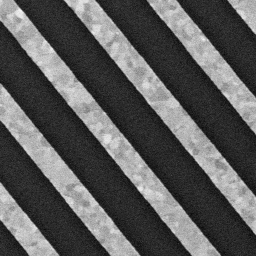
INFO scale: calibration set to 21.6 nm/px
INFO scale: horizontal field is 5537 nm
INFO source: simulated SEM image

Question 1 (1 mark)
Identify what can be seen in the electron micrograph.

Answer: lines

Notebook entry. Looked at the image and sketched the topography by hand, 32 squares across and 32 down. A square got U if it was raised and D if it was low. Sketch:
UUDDDDDDUUUUDDDDDDDUUUDDDDDDDUUU
UUUDDDDDDUUUUDDDDDDDUUUDDDDDDDUU
UUUUDDDDDDUUUUDDDDDDUUUUDDDDDDDU
DUUUDDDDDDDUUUUDDDDDDUUUUDDDDDDU
DDUUUDDDDDDDUUUUDDDDDDUUUUDDDDDD
DDUUUUDDDDDDDUUUDDDDDDDUUUDDDDDD
DDDUUUUDDDDDDUUUUDDDDDDDUUUDDDDD
DDDDUUUUDDDDDDUUUUDDDDDDUUUUDDDD
DDDDDUUUDDDDDDDUUUUDDDDDDUUUUDDD
DDDDDDUUUDDDDDDDUUUUDDDDDDUUUUDD
DDDDDDDUUUDDDDDDDUUUDDDDDDDUUUDD
UDDDDDDUUUUDDDDDDUUUUDDDDDDDUUUD
UUDDDDDDUUUUDDDDDDUUUUDDDDDDDUUU
UUUDDDDDDUUUUDDDDDDUUUUDDDDDDUUU
UUUDDDDDDDUUUDDDDDDDUUUUDDDDDDUU
UUUUDDDDDDDUUUDDDDDDDUUUDDDDDDDU
DUUUUDDDDDDUUUUDDDDDDDUUUDDDDDDD
DDUUUUDDDDDDUUUUDDDDDDUUUUDDDDDD
DDDUUUUDDDDDDUUUUDDDDDDUUUUDDDDD
DDDDUUUDDDDDDDUUUDDDDDDDUUUUDDDD
DDDDDUUUDDDDDDDUUUDDDDDDDUUUUDDD
DDDDDUUUUDDDDDDUUUUDDDDDDDUUUDDD
DDDDDDUUUUDDDDDDUUUUDDDDDDUUUUDD
DDDDDDDUUUUDDDDDDUUUUDDDDDDUUUUD
UDDDDDDDUUUDDDDDDDUUUDDDDDDDUUUU
UUDDDDDDDUUUDDDDDDDUUUDDDDDDDUUU
UUUDDDDDDUUUUDDDDDDDUUUDDDDDDDUU
UUUUDDDDDDUUUUDDDDDDUUUUDDDDDDDU
DUUUUDDDDDDUUUUDDDDDDUUUUDDDDDDU
DDUUUDDDDDDDUUUDDDDDDDUUUUDDDDDD
DDDUUUDDDDDDDUUUDDDDDDDUUUDDDDDD
DDDUUUUDDDDDDDUUUDDDDDDDUUUDDDDD